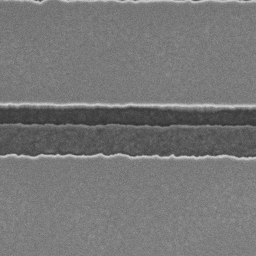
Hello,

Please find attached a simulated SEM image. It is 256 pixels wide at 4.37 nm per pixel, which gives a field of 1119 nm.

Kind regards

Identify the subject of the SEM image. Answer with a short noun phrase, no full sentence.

lines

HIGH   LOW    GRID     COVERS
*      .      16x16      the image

****************
****************
****************
****************
****************
****************
****************
................
................
................
****************
****************
****************
****************
****************
****************